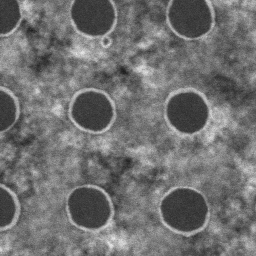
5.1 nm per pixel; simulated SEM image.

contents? raised bodies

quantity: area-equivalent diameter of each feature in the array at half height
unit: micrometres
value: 0.243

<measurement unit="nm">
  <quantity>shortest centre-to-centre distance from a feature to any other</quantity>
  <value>484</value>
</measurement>